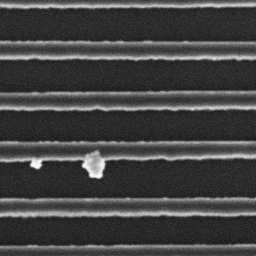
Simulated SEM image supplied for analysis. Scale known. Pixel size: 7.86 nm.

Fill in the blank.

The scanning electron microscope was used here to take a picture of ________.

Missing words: lines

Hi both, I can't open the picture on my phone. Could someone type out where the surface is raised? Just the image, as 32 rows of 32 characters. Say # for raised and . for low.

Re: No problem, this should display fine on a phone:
################################
................................
................................
................................
................................
################################
################################
................................
................................
................................
................................
..................#.############
################################
################################
................................
................................
................................
................................
################################
################################
....#.....###...................
...........##...................
................................
................................
................................
################################
################################
................................
................................
................................
................................
################################